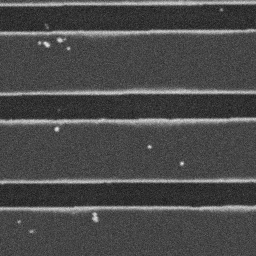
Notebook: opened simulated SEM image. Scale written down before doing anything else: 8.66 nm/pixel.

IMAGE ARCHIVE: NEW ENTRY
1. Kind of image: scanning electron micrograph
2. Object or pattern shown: lines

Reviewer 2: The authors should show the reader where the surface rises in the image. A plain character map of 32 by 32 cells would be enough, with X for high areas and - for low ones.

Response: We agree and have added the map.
XXXXXXXXXXXXXXXXXXX-------------
--------------------------------
--------------------------------
--------------------------------
XXXXXXXXXXXXXXXXXXXXXXXXXXXXXXXX
XXXXXXXXXXXXXXXXXXXXXXXXXXXXXXXX
XXXXXXXXXXXXXXXXXXXXXXXXXXXXXXXX
XXXXXXXXXXXXXXXXXXXXXXXXXXXXXXXX
XXXXXXXXXXXXXXXXXXXXXXXXXXXXXXXX
XXXXXXXXXXXXXXXXXXXXXXXXXXXXXXXX
XXXXXXXXXXXXXXXXXXXXXXXXXXXXXXXX
XXXXXXXXXXXXXXXXXXXXXXXXXXXXXXXX
--------------------------------
--------------------------------
--------------------------------
XXXXXXXXXXXXXXXXXXXXXXXXXXXXXXXX
XXXXXXXXXXXXXXXXXXXXXXXXXXXXXXXX
XXXXXXXXXXXXXXXXXXXXXXXXXXXXXXXX
XXXXXXXXXXXXXXXXXXXXXXXXXXXXXXXX
XXXXXXXXXXXXXXXXXXXXXXXXXXXXXXXX
XXXXXXXXXXXXXXXXXXXXXXXXXXXXXXXX
XXXXXXXXXXXXXXXXXXXXXXXXXXXXXXXX
XXXXXXXXXXXXXXXXXXXXXXXXXXXXXXXX
--------------------------------
--------------------------------
--------------------------------
XXXXXXXXXXXXXXXXXXXXXXXXXXXXXXXX
XXXXXXXXXXXXXXXXXXXXXXXXXXXXXXXX
XXXXXXXXXXXXXXXXXXXXXXXXXXXXXXXX
XXXXXXXXXXXXXXXXXXXXXXXXXXXXXXXX
XXXXXXXXXXXXXXXXXXXXXXXXXXXXXXXX
XXXXXXXXXXXXXXXXXXXXXXXXXXXXXXXX